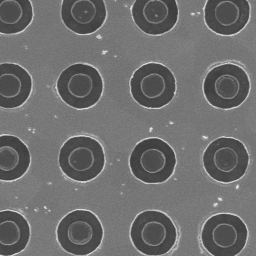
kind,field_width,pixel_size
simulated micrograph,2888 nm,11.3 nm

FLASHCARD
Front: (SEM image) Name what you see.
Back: a regular array of ring-shaped grooves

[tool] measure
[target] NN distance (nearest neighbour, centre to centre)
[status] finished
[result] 818 nm